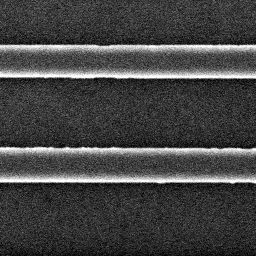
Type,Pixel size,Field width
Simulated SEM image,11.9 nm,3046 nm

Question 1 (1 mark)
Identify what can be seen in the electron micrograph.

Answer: lines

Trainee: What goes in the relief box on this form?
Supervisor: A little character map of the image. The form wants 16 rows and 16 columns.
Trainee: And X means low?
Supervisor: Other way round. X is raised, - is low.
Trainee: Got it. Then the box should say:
----------------
----------------
----------------
XXXXXXXXXXXXXXXX
XXXXXXXXXXXXXXXX
----------------
----------------
----------------
----------------
XXXXXXXXXXXXXXXX
XXXXXXXXXXXXXXXX
----------------
----------------
----------------
----------------
----------------